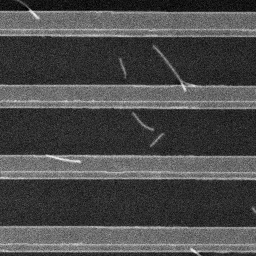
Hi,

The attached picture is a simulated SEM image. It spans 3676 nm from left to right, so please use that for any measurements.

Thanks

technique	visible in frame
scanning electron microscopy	lines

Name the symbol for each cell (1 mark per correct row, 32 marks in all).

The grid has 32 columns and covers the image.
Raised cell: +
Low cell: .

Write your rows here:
................................
+++++++++++++++.................
++++++++++++++++++++++++++++++++
++++++++++++++++++++++++++++++++
...........+++++++++++++++++++++
................................
................................
................................
................................
................................
................................
++++++++++++++++++++++++++++++++
++++++++++++++++++++++++++++++++
....................++++++++++++
................................
................................
................................
................................
................................
++++++++++++....................
++++++++++++++++++++++++++++++++
++++++++++++++++++++++++++++++++
................................
................................
................................
................................
................................
................................
++++++++++++++++++++++++++++++++
++++++++++++++++++++++++++++++++
++++++++++++++++++++++++++++++++
........................+.......